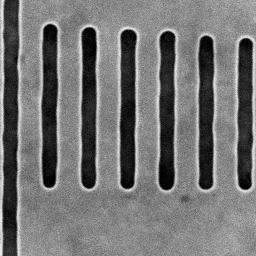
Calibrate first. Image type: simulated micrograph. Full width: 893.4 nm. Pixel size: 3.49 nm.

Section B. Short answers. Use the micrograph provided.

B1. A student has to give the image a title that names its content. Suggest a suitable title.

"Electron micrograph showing groups of lines, slits or small figures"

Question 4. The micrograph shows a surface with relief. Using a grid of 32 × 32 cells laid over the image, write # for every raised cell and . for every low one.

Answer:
..##############################
..##############################
..##############################
..####.#########################
..###..###..###..###..##########
..###..###..###..###..###..###..
..###..###..###..###..###..###..
..###..###..###..###..###..###..
..###..###..###..###..###..###..
..###..###..###..###..###..###..
..###..###..###..###..###..###..
..###..###..###..###..###..###..
..###..###..###..###..###..###..
..###..###..###..###..###..###..
..###..###..###..###..###..###..
..###..###..###..###..###..###..
..###..###..###..###..###..###..
..###..###..###..###..###..###..
..###..###..###..###..###..###..
..###..###..###..###..###..###..
..###..###..###..###..###..###..
..###..###..###..###..###..###.#
..###..###..###..###..###..###.#
..#############.####.####.####.#
..##############################
..##############################
..##############################
..##############################
..##############################
..##############################
..##############################
..##############################